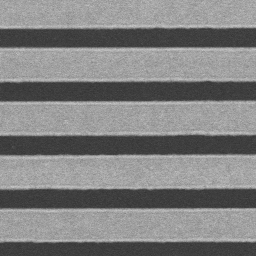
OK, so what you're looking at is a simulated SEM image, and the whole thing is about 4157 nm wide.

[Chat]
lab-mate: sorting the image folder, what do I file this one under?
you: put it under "lines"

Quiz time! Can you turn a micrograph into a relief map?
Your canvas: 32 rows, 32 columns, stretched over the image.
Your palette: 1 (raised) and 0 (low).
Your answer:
11111111111111111111111111111111
11111111111111111111111111111111
11111111111111111111111111111111
11111111001000000000000000000000
00000000000000000000000000000000
00000000000000000000000000000000
11111111111111111111111111111111
11111111111111111111111111111111
11111111111111111111111111111111
11111111111111111111111111111111
00000000000000000000000000000000
00000000000000000000000000000000
00000000000000000000000000000000
11111111111111111111111111111111
11111111111111111111111111111111
11111111111111111111111111111111
11111111111111111111111111111111
00000000000000000000000000000000
00000000000000000000000000000000
11111111111111111111111111111111
11111111111111111111111111111111
11111111111111111111111111111111
11111111111111111111111111111111
11111111111111111111111111111110
00000000000000000000000000000000
00000000000000000000000000000000
11111111111111111111111111111111
11111111111111111111111111111111
11111111111111111111111111111111
11111111111111111111111111111111
00000000000000000000000000000000
00000000000000000000000000000000